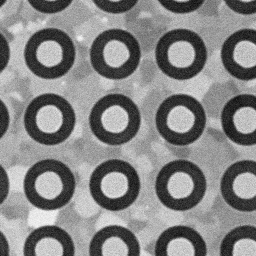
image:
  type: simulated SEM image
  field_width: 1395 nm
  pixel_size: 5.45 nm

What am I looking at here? an array of small figures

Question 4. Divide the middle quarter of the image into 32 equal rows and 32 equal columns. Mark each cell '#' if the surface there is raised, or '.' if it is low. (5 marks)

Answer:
..#####.....##.....####.....###.
..#####...........######........
.#######.........########.......
##########......##########......
################################
################################
################################
###########...##############...#
#########........#########......
.#######..........#######.......
..#####.....##....######........
...####....####....####....####.
...###....######...####...######
...###....######...####...######
...###....######...####...######
...###....#####....####...######
..#####....####....####....####.
..#####...........######........
.#######.........########.......
#########.......##########......
############..##############..##
################################
################################
############.###################
##########......##########......
.#######.........########.......
..#####...........######........
..#####....###.....####....###..
...###....#####....####....#####
...###....######...####...######
...###....######...####...######
...###....######...####...######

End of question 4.